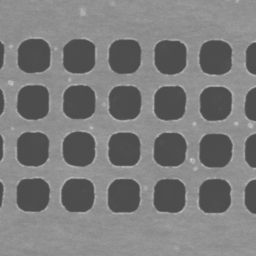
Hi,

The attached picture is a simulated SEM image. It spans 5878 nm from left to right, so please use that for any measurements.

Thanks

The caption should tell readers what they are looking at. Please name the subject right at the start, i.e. a regular array of holes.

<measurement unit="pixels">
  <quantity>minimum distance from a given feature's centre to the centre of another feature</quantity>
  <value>45.3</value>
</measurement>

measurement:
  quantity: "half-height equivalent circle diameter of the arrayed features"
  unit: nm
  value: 814